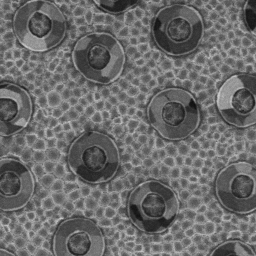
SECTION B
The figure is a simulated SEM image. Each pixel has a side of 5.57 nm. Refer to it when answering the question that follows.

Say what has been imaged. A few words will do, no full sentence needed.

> ring-shaped raised bodies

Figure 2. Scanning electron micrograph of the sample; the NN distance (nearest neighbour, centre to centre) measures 0.464 µm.